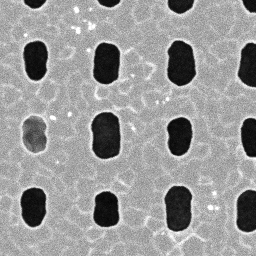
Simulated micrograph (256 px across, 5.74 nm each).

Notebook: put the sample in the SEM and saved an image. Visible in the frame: a regular array of holes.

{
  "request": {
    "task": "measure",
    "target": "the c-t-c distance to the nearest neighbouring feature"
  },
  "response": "413 nanometres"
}